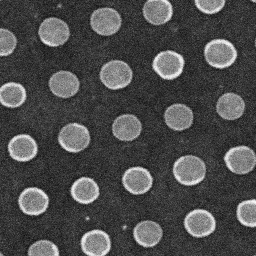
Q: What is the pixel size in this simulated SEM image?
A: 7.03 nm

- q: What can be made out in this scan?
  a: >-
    a regular array of raised bodies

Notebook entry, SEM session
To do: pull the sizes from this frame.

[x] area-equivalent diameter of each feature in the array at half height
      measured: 0.199 µm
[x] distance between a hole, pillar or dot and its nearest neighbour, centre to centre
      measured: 0.371 um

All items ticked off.